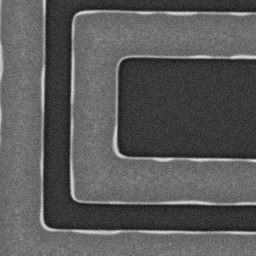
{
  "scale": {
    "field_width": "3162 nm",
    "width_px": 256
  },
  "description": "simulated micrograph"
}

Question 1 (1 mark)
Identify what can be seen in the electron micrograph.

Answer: groups of lines, slits or small figures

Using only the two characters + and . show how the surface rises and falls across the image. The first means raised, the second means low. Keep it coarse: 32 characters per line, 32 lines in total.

++++++..........................
++++++......+++.................
++++++...+++++++++++++++++++++++
++++++...+++++++++++++++++++++++
++++++...+++++++++++++++++++++++
++++++...+++++++++++++++++++++++
++++++...+++++++++++++++++++++++
++++++...++++++.................
++++++...++++++.................
+++++....++++++.................
+++++....++++++.................
+++++....++++++.................
+++++....++++++.................
+++++....++++++.................
+++++....++++++.................
+++++....++++++.................
+++++....+++++..................
+++++....+++++..................
+++++....+++++..................
+++++....++++++.................
+++++....+++++++++++++++++++++++
+++++....+++++++++++++++++++++++
+++++....+++++++++++++++++++++++
+++++....+++++++++++++++++++++++
+++++....+++++++++++++++++++++++
+++++.....................++++..
+++++...........................
+++++...........................
++++++..........................
++++++++++++++++++++++++++++++++
++++++++++++++++++++++++++++++++
++++++++++++++++++++++++++++++++